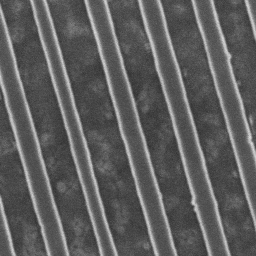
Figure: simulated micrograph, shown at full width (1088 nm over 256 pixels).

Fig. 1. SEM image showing parallel lines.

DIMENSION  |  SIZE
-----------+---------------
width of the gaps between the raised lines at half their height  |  0.138 microns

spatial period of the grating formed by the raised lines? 221 nm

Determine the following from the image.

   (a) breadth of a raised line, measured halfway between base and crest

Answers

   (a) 83.5 nm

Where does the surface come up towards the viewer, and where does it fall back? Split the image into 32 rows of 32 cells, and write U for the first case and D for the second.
DDDDUUDDDDDUUDDDDDUUDDDDUUUDDDDU
DDDDUUDDDDDUUUDDDDUUDDDDUUUDDDDU
UDDDUUDDDDDUUUDDDDUUUDDDDUUDDDDU
UDDDDUUDDDDDUUDDDDUUUDDDDUUDDDDD
UDDDDUUDDDDDUUDDDDDUUDDDDUUUDDDD
UDDDDUUDDDDDUUUDDDDUUDDDDDUUDDDD
UUDDDDUUDDDDDUUDDDDUUUDDDDUUDDDD
UUDDDDUUDDDDDUUDDDDUUUDDDDUUUDDD
UUDDDDUUDDDDDUUUDDDDUUDDDDUUUDDD
UUDDDDUUDDDDDUUUDDDDUUUDDDDUUDDD
UUUDDDDUUDDDDDUUDDDDUUUDDDDUUDDD
UUUDDDDUUDDDDDUUDDDDDUUDDDDUUUDD
DUUDDDDUUDDDDDUUUDDDDUUDDDDDUUDD
DUUDDDDDUDDDDDUUUDDDDUUUDDDDUUDD
DUUUDDDDUUDDDDDUUDDDDUUUDDDDUUUD
DDUUDDDDUUDDDDDUUDDDDDUUDDDDUUUD
DDUUDDDDUUDDDDDUUUDDDDUUUDDDDUUD
DDUUUDDDDUUDDDDUUUDDDDUUUDDDDUUD
DDUUUDDDDUUDDDDDUUDDDDUUUDDDDUUU
DDDUUDDDDUUDDDDDUUUDDDDUUDDDDUUU
DDDUUDDDDDUDDDDDUUUDDDDUUUDDDDUU
DDDUUUDDDDUUDDDDDUUDDDDUUUDDDDUU
DDDUUUDDDDUUDDDDDUUDDDDDUUDDDDUU
DDDDUUDDDDUUDDDDDUUUDDDDUUDDDDDU
DDDDUUUDDDDUDDDDDUUUDDDDUUUDDDDU
DDDDUUUDDDDUUDDDDDUUDDDDUUUDDDDU
DDDDDUUDDDDUUDDDDDUUUDDDDUUDDDDU
UDDDDUUDDDDUUDDDDDUUUDDDDUUDDDDD
UDDDDUUUDDDDUUDDDDDUUDDDDUUUDDDD
UDDDDUUUDDDDUUDDDDDUUDDDDDUUDDDD
UDDDDDUUDDDDUUDDDDDUUUDDDDUUDDDD
UUDDDDUUDDDDDUDDDDDUUUDDDDUUUDDD